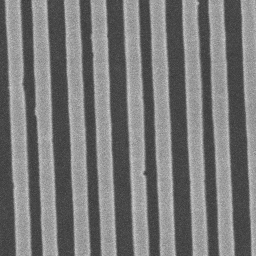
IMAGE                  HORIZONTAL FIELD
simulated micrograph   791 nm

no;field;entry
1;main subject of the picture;parallel lines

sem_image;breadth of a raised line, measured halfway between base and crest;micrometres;0.0462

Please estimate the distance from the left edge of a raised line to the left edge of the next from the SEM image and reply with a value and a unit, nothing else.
89.4 nm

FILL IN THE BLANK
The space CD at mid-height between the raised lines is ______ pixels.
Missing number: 15.3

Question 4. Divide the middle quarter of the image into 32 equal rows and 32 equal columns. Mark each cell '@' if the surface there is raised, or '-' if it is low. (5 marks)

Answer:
-@@@---@@@@-----@@@---@@@@----@@
-@@@---@@@@-----@@@---@@@@----@@
-@@@@--@@@@-----@@@---@@@@-----@
-@@@@--@@@@-----@@@---@@@@-----@
-@@@@--@@@@-----@@@---@@@@----@@
-@@@@---@@@-----@@@@--@@@@----@@
-@@@@---@@@-----@@@----@@@----@@
-@@@@---@@@-----@@@@---@@@-----@
-@@@@---@@@-----@@@@---@@@-----@
-@@@@---@@@-----@@@@---@@@-----@
-@@@@---@@@-----@@@@---@@@-----@
-@@@@---@@@-----@@@@---@@@-----@
-@@@@---@@@@----@@@@---@@@-----@
-@@@@---@@@@----@@@@---@@@-----@
--@@@---@@@@----@@@@---@@@-----@
--@@@---@@@@----@@@@---@@@-----@
--@@@---@@@@----@@@@---@@@-----@
--@@@---@@@@----@@@@---@@@@----@
--@@@---@@@@----@@@@---@@@@----@
--@@@---@@@@----@@@@---@@@@----@
--@@@@--@@@@-----@@@---@@@@----@
--@@@@--@@@@-----@@@---@@@@----@
--@@@---@@@@-----@@@---@@@@----@
--@@@---@@@@-----@@@---@@@@----@
--@@@---@@@@-----@@@---@@@@----@
--@@@@--@@@@-----@@@---@@@@----@
--@@@@--@@@@-----@@@---@@@@-----
--@@@@--@@@@-----@@@---@@@@-----
--@@@@---@@@-----@@@---@@@@-----
--@@@@---@@@-----@@@----@@@-----
--@@@@---@@@-----@@@----@@@-----
--@@@@---@@@-----@@@@---@@@-----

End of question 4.